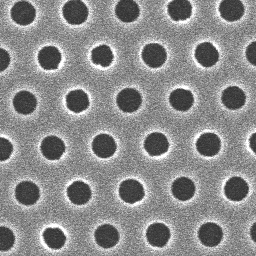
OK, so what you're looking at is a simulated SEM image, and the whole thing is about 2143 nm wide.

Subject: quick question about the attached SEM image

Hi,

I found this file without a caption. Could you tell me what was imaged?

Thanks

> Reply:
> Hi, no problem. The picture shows a regular array of holes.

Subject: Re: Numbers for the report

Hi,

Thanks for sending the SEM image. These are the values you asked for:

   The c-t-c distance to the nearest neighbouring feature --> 430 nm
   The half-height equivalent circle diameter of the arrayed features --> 25.4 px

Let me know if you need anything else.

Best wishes